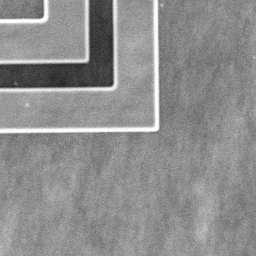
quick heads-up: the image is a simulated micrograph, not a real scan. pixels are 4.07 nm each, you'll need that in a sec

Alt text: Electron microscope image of groups of lines, slits or small figures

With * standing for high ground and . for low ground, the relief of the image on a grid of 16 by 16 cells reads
...**..***......
*****..***......
*****..***......
*****..***......
.......***......
.......***......
**********......
**********......
................
................
................
................
................
................
................
................